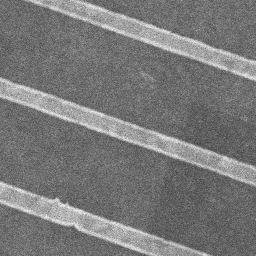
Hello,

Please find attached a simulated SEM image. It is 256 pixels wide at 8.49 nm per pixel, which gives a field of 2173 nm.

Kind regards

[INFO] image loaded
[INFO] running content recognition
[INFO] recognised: one or a few lines or trenches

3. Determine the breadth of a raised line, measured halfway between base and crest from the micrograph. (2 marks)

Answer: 133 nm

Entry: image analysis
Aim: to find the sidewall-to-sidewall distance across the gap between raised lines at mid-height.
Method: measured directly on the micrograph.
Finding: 710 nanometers